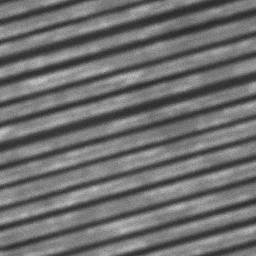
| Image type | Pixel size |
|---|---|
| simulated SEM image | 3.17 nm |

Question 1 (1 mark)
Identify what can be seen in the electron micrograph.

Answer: parallel lines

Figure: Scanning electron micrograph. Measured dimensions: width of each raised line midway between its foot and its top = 38.2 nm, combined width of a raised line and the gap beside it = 0.0636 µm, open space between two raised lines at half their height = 7.44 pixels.